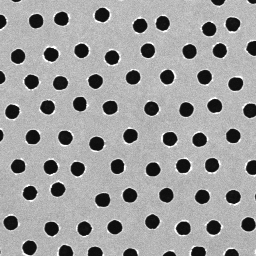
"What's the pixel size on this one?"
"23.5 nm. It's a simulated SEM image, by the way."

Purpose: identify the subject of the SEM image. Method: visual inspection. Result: a regular array of holes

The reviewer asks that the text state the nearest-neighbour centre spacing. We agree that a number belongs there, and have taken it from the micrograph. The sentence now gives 681 nanometers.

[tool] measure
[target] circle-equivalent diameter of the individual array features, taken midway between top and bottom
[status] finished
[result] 0.349 µm